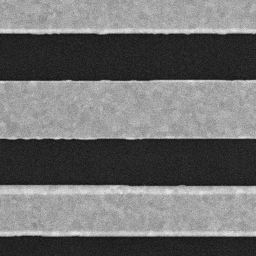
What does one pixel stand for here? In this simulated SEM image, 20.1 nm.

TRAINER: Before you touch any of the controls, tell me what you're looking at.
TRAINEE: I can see lines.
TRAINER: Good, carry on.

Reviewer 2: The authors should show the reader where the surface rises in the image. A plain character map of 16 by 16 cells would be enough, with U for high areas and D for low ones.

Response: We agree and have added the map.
UUUUUUUUUUUUUUUU
UUUUUUUUUUUUUUUU
DDDDDDDDDDDDDDDD
DDDDDDDDDDDDDDDD
DDDDDDDDDDDDDDDD
UUUUUUUUUUUUUUUU
UUUUUUUUUUUUUUUU
UUUUUUUUUUUUUUUU
UUUUUUUUUUUUUUUU
DDDDDDDDDDDDDDDD
DDDDDDDDDDDDDDDD
DDDDDDDDDDDDDDDD
UUUUUUUUUUUUUUUU
UUUUUUUUUUUUUUUU
UUUUUUUUUUUUUUUU
DDDDDDDDDDDDDDDD